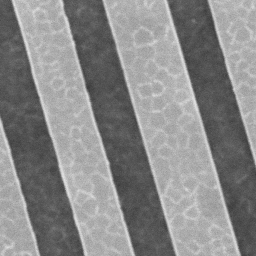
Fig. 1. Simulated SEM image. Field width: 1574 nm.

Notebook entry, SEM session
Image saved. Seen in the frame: one or a few lines or trenches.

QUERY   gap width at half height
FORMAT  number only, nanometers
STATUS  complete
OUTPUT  258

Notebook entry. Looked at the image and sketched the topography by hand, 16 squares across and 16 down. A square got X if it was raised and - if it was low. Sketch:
-XXX---XXX---XXX
-XXX---XXXX--XXX
--XXX--XXXX---XX
--XXX--XXXX---XX
--XXX---XXXX--XX
--XXX---XXXX---X
---XXX--XXXX---X
---XXX---XXXX--X
---XXX---XXXX---
X---XX---XXXX---
X---XXX--XXXX---
X---XXX---XXXX--
X---XXX---XXXX--
XX---XXX--XXXX--
XX---XXX---XXXX-
XX---XXX---XXXX-